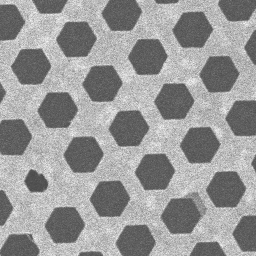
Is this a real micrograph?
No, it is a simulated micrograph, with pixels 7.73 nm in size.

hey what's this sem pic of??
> a regular array of holes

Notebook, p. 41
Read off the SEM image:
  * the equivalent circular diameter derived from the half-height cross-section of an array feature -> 290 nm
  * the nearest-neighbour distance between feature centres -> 397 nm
